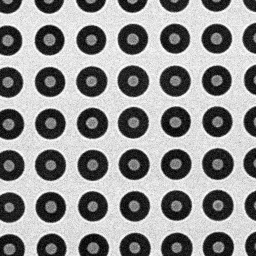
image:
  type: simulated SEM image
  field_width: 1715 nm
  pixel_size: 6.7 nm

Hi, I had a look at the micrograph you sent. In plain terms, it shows an array of small figures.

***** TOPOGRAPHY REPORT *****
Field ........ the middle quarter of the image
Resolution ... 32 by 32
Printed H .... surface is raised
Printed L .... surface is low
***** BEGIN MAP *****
HHHHHHLLHHHHHHHHLLLHHHHHHHLLLHHH
HHHHLLLLLLHHHHLLLLLLHHHHHLLLLLLH
HHHLLLLLLLHHHHLLLLLLLHHHLLLLLLLH
HHHLLLHHLLLHHLLLHHLLLHHHLLLHHLLL
LHHLLLHHLLLHHLLLHHLLLLHHLLLHHLLL
HHHLLLLLLLLHHHLLLLLLLHHHLLLLLLLL
HHHHLLLLLLHHHHLLLLLLLHHHLLLLLLLH
HHHHLLLLLHHHHHHLLLLLHHHHHLLLLLHH
HHHHHHHHHHHHHHHHHLHHHHHHHHHHHHHH
HHHHHHHHHHHHHHHHHHHHHHHHHHHHHHHH
HHHHHHHHHHHHHHHHHLHHHHHHHHHLHHHH
HHHHHLLLLHHHHHHLLLLLHHHHHHLLLLLH
HHHHLLLLLLHHHHLLLLLLLHHHHLLLLLLH
HHHLLLHHLLLHHLLLLLLLLHHHLLLLLLLL
LHHLLLHHLLLHHLLLHHHLLHHHLLLHHLLL
LHHLLLHHLLLHHLLLHHLLLHHHLLLHHLLL
HHHLLLLLLLLHHHLLLLLLLHHHHLLLLLLH
HHHHLLLLLLHHHHLLLLLLHHHHHLLLLLHH
HHHHHLLLLHHHHHHHLLLHHHHHHHHHHHHH
HHHHHHHHHHHHHHHHHHHHHHHHHHHHHHHH
HHHHHHHHHHHHHHHHHHHHHHHHHHHHHHHH
HHHHHHLLHHHHHHHHLLLHHHHHHHLLLLHH
HHHHLLLLLLHHHHLLLLLLLHHHHLLLLLLH
HHHHLLLLLLLHHHLLLLLLLHHHLLLLLLLL
HHHLLLHHLLLHHHLLHHHLLLHHLLLHHLLL
LHHLLLHHLLLHHHLLHHHLLLHHLLLHHLLL
LHHLLLLHLLLHHHLLLLLLLHHHLLLLLLLL
HHHHLLLLLLLHHHLLLLLLLHHHHLLLLLLH
HHHHHLLLLLHHHHHHLLLLHHHHHHLLLLHH
HHHHHHHHHHHHHHHHHHHHHHHHHHHHHHHH
HHHHHHHHHHHHHHHHHHHHHHHHHHHHHHHH
HHHHHHHHHHHHHHHHHHHHHHHHHHHLLHHH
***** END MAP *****